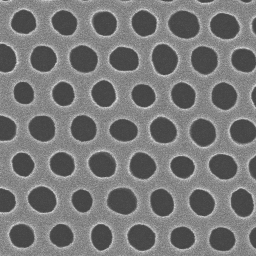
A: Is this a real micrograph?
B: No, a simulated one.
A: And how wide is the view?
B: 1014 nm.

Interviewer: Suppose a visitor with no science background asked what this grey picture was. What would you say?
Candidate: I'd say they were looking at a regular array of holes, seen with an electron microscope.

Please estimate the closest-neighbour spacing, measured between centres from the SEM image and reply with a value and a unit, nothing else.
157 nm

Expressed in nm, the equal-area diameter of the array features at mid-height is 100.